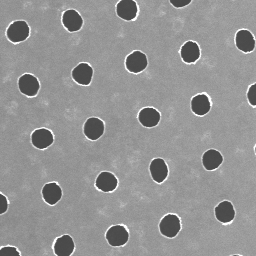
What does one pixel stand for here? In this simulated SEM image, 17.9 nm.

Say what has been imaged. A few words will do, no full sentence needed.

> a regular array of holes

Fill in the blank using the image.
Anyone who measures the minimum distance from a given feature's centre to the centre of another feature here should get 966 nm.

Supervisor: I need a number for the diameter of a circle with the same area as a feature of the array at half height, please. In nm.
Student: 375